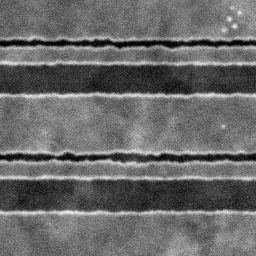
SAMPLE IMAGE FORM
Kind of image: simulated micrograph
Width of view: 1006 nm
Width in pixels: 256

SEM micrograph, lines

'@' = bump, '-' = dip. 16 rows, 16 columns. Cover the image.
@@@@@@@@@@@@@@@@
@@@@@@@@@@@@@@@@
@@@@@@@@@@@@@@@@
@@@@@@@@@@@@@@@@
----------------
----------------
@@@@@@@@@@@@@@@@
@@@@@@@@@@@@@@@@
@@@@@@@@@@@@@@@@
@@@@@@@@@@@@@@@@
@@@@@@@@@@@@@@@@
----------------
----------------
@@@@@@@@@@@@@@@@
@@@@@@@@@@@@@@@@
@@@@@@@@@@@@@@@@